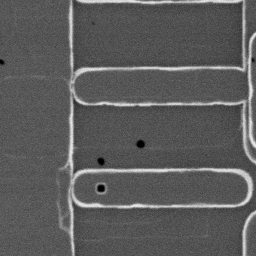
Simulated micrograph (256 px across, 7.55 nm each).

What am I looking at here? wiring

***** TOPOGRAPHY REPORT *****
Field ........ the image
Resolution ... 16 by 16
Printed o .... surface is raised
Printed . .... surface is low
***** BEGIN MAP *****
oooo...........o
oooo...........o
oooo...........o
ooooo..........o
oooooooooooooooo
oooooooooooooooo
oooooo.oooooo..o
oooo...........o
oooo...........o
oooo...........o
ooooo...........
oooooooooooooooo
ooooooooooooooo.
oooo............
ooooo..........o
ooooo..........o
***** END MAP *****